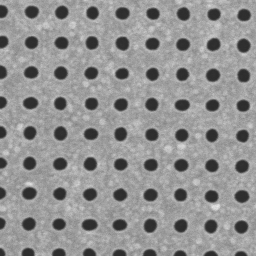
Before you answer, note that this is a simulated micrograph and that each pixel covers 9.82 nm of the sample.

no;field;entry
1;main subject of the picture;a regular array of holes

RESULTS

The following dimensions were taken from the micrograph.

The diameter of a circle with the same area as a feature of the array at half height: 0.131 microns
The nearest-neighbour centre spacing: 294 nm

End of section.